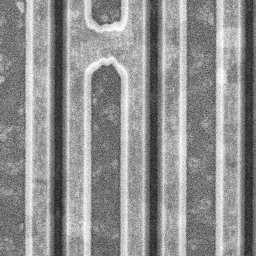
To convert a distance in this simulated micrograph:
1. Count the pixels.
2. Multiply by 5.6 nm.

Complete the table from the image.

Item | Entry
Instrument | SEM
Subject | parallel lines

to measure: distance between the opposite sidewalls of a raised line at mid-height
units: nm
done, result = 124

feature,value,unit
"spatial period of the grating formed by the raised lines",267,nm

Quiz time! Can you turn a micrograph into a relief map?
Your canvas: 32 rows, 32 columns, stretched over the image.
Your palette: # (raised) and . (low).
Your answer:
....##..###.....##..###.....##..
....##..###.....##..###.....##..
....##..###.....##..###.....##..
....##..####..####..###.....##..
....##..##########..###.....##..
....##..##########..###.....##..
....##..##########..###.....##..
....##..##########..###.....##..
....##..####...###..###.....##..
....##..###....###..###.....##..
....##..###.....##..###.....##..
....##..###.....##..###.....##..
....##..###.....##..###.....##..
....##..###.....##..###.....##..
....##..###.....##..###.....##..
....##..###.....##..###.....##..
....##..###.....##..###.....##..
....##..###.....##..###.....##..
....##..###.....##..###....###..
....##..###.....##..###....###..
....##..###.....##..###....###..
....##..###.....##..###....###..
....##..###.....##..###....###..
....##..###.....##..###....###..
....##..###.....##..###....###..
....##..###.....##..###....###..
....##..###.....##..###....###..
....##..###.....##..###....###..
....##..###.....##..###....###..
....##..###.....##..###....###..
....##..###.....##..###....###..
....##..###.....##..###....###..